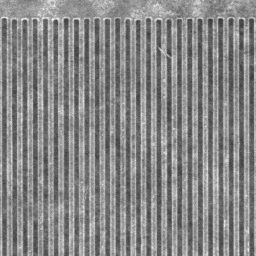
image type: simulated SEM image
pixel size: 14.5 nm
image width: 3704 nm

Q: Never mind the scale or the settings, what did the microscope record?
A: parallel lines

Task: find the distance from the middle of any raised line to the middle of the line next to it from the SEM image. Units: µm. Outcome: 0.149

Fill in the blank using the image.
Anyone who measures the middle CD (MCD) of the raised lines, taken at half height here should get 65.1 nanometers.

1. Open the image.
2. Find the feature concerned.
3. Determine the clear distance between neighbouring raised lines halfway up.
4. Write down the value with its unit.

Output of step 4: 77.8 nanometers